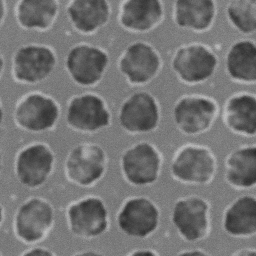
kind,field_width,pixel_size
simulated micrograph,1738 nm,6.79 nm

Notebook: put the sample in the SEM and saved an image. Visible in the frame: a regular array of holes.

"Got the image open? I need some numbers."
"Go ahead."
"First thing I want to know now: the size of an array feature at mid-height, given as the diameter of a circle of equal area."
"272 nanometers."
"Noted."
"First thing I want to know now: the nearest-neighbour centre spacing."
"342 nanometres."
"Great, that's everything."